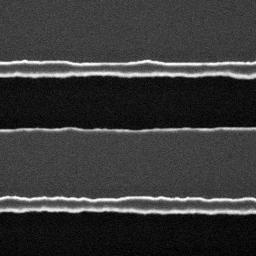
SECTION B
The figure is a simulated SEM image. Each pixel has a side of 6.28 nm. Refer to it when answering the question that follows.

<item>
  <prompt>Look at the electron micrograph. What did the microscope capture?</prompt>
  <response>lines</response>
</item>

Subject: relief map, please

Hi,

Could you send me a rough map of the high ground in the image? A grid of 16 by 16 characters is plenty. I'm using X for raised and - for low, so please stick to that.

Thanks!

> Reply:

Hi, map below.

XXXXXXXXXXXXXXXX
XXXXXXXXXXXXXXXX
XXXXXXXXXXXXXXXX
XXXXXXXXXXXXXXXX
XXXXXXXXXXXXXXXX
----------------
----------------
----------------
XXXXXXXXXXXXXXXX
XXXXXXXXXXXXXXXX
XXXXXXXXXXXXXXXX
XXXXXXXXXXXXXXXX
XXXXXXXXXXXXXXXX
----------------
----------------
----------------